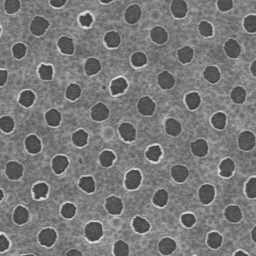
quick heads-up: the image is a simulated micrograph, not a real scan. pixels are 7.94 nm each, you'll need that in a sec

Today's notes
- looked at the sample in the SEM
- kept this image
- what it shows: a regular array of holes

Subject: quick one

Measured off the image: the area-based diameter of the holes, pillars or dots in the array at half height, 139 nanometres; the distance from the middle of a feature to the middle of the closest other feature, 256 nm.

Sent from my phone